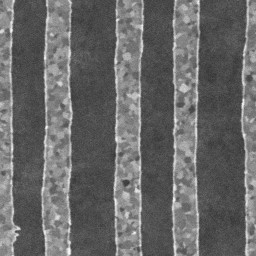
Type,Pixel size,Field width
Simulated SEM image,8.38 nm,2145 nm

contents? one or a few lines or trenches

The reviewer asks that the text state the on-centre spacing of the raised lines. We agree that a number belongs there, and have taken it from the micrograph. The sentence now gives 0.536 micrometres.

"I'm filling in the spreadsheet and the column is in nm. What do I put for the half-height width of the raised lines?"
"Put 201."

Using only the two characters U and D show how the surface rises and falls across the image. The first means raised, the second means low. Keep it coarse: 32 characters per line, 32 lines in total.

UUDDDDUUUDDDDDDUUUDDDDUUUDDDDDDU
UUDDDDUUUDDDDDDUUUDDDDUUUDDDDDDU
UUDDDDUUUDDDDDDUUUDDDDUUUDDDDDDU
UDDDDDUUUDDDDDDUUUDDDDUUUDDDDDDU
UDDDDDUUUDDDDDDUUUDDDDUUUDDDDDDU
UDDDDDUUUDDDDDDUUUDDDDUUUDDDDDDU
UDDDDDUUUDDDDDDUUUDDDDUUUDDDDDDU
UDDDDDUUUDDDDDUUUUDDDDUUUDDDDDDU
UDDDDDUUUDDDDDUUUDDDDDUUUDDDDDUU
UDDDDDUUUDDDDDDUUDDDDDUUUDDDDDUU
UDDDDDUUUDDDDDDUUDDDDDUUUDDDDDUU
UDDDDDUUUDDDDDDUUUDDDDUUUDDDDDDU
UDDDDDUUUDDDDDDUUDDDDDUUUDDDDDUU
UDDDDDUUUDDDDDDUUDDDDDUUUDDDDDUU
UDDDDDUUUDDDDDDUUDDDDDUUDDDDDDUU
UDDDDDUUUDDDDDDUUUDDDDUUDDDDDDUU
UDDDDDUUUDDDDDDUUDDDDDUUDDDDDDUU
UDDDDDUUUDDDDDDUUDDDDDUUUDDDDDDU
UDDDDDUUUDDDDDDUUDDDDDUUDDDDDDDU
UDDDDDUUUDDDDDDUUUDDDDUUDDDDDDDU
UDDDDDUUUDDDDDDUUUDDDDUUDDDDDDDU
UDDDDDUUUDDDDDDUUUDDDDUUDDDDDDDU
UDDDDDUUUDDDDDDUUDDDDDUUDDDDDDDU
UDDDDUUUUDDDDDUUUUDDDDUUUDDDDDDU
UDDDDUUUDDDDDDUUUUDDDDUUUDDDDDDU
UUDDDUUUUDDDDDDUUUDDDDUUUDDDDDDU
UUDDDUUUUDDDDDDUUUDDDDUUUDDDDDDU
UUDDDUUUUDDDDDDUUUDDDDUUUDDDDDDU
UUDDDUUUUDDDDDDUUUDDDDUUUDDDDDDU
UUDDDDUUUDDDDDDUUUDDDDUUUDDDDDDU
UUDDDDUUUDDDDDDUUUDDDDUUUDDDDDDU
UUDDDDUUUDDDDDDUUUDDDDUUUDDDDDDU